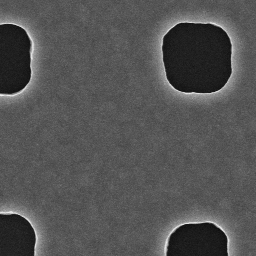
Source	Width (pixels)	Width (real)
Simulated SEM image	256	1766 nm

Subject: holes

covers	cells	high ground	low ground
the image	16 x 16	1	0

1111111111111111
1111111111100111
0011111111000011
0011111111000011
0011111111000011
0111111111100011
1111111111111111
1111111111111111
1111111111111111
1111111111111111
1111111111111111
1111111111111111
1111111111111111
0111111111111111
0011111111100011
0011111111000011